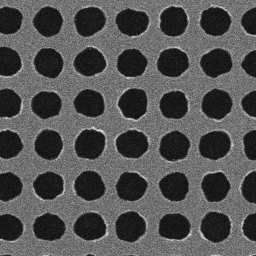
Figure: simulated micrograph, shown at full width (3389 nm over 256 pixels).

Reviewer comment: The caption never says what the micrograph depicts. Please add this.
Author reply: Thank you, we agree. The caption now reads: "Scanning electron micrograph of a regular array of holes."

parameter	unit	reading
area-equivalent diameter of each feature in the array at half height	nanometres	397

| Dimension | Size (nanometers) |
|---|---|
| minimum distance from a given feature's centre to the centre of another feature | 539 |